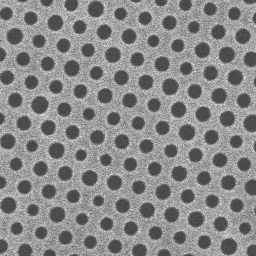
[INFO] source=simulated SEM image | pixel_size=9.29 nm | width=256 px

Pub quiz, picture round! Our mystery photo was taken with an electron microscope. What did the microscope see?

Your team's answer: a regular array of holes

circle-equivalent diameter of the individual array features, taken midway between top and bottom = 135 nanometres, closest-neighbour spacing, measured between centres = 224 nanometres